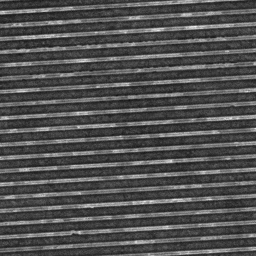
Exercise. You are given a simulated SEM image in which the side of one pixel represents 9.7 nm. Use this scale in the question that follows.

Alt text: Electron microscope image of parallel lines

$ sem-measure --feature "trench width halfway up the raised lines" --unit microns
0.0968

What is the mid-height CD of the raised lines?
0.0266 micrometres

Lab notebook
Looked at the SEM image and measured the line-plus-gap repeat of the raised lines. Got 128 nanometres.